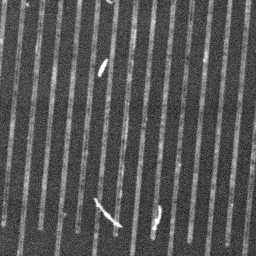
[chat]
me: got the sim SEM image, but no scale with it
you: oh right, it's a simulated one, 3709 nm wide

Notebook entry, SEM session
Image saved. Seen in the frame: parallel lines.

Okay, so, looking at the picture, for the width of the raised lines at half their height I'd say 36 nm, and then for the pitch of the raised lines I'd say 271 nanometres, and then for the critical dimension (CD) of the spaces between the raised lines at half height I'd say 236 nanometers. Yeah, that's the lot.